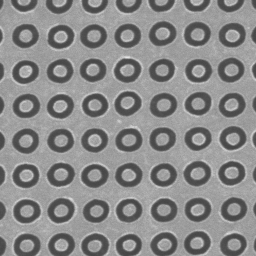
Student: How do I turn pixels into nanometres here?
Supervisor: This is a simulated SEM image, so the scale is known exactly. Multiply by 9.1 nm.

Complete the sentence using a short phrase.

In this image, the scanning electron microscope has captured a regular array of ring-shaped grooves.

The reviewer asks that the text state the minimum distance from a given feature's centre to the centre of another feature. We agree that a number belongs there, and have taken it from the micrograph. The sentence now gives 308 nanometres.